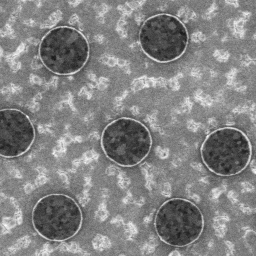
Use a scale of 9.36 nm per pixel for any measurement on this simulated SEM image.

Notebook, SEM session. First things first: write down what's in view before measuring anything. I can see raised bodies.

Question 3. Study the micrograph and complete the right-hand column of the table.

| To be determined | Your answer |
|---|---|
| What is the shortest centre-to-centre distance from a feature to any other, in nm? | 920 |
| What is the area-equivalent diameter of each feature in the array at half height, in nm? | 454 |